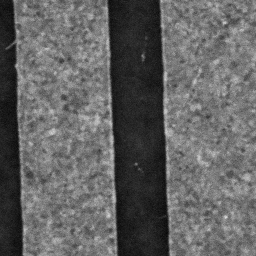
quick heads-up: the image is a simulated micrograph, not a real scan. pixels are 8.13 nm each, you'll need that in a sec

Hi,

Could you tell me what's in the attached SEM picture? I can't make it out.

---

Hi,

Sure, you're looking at one or a few lines or trenches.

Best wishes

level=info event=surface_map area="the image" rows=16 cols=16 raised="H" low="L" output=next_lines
LHHHHHHLLLHHHHHH
LHHHHHHLLLHHHHHH
LHHHHHHLLLHHHHHH
LHHHHHHLLLHHHHHH
LHHHHHHLLLHHHHHH
LHHHHHHLLLHHHHHH
LHHHHHHLLLHHHHHH
LHHHHHHLLLHHHHHH
LHHHHHHLLLHHHHHH
LHHHHHHLLLHHHHHH
LHHHHHHLLLHHHHHH
LHHHHHHLLLHHHHHH
LHHHHHHLLLLHHHHH
LHHHHHHLLLLHHHHH
LHHHHHHLLLLHHHHH
LLHHHHHLLLLHHHHH